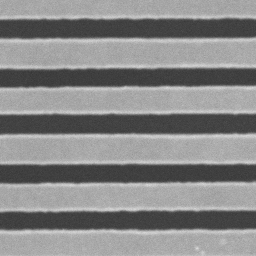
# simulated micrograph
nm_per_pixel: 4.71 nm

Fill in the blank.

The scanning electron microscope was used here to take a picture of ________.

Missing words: lines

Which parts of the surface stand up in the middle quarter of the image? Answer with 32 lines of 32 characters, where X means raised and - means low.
XXXXXXXXXXXXXXXXXXXXXXXXXXXXXXXX
--------------------------------
--------------------------------
--------------------------------
--------------------------------
--------------------------------
XXXXXXXXXXXXXXXXXXXXXXXXXXXXXXXX
XXXXXXXXXXXXXXXXXXXXXXXXXXXXXXXX
XXXXXXXXXXXXXXXXXXXXXXXXXXXXXXXX
XXXXXXXXXXXXXXXXXXXXXXXXXXXXXXXX
XXXXXXXXXXXXXXXXXXXXXXXXXXXXXXXX
XXXXXXXXXXXXXXXXXXXXXXXXXXXXXXXX
--------------------------------
--------------------------------
--------------------------------
--------------------------------
--------------------------------
--------------------------------
XXXXXXXXXXXXXXXXXXXXXXXXXXXXXXXX
XXXXXXXXXXXXXXXXXXXXXXXXXXXXXXXX
XXXXXXXXXXXXXXXXXXXXXXXXXXXXXXXX
XXXXXXXXXXXXXXXXXXXXXXXXXXXXXXXX
XXXXXXXXXXXXXXXXXXXXXXXXXXXXXXXX
XXXXXXXXXXXXXXXXXXXXXXXXXXXXXXXX
XXXXXXXXXXXXXXXXXXXXXXXXXXXXXXXX
--------------------------------
--------------------------------
--------------------------------
--------------------------------
--------------------------------
XXXXXXXXXXXXXXXXXXXXXXXXXXXXXXXX
XXXXXXXXXXXXXXXXXXXXXXXXXXXXXXXX